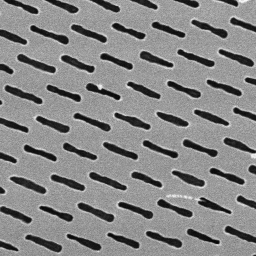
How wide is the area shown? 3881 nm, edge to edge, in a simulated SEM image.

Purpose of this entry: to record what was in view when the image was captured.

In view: a regular array of holes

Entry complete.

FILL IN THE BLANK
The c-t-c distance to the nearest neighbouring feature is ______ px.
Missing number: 32.4